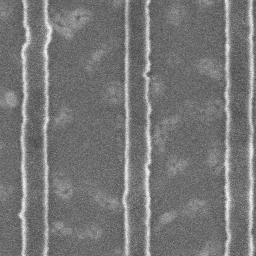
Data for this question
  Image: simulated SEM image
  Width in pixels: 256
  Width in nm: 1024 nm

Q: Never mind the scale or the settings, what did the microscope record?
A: one or a few lines or trenches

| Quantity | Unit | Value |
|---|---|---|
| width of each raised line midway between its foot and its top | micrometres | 0.0946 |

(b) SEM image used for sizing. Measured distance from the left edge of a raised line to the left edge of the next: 408 nm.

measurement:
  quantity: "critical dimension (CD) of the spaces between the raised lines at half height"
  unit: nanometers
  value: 316